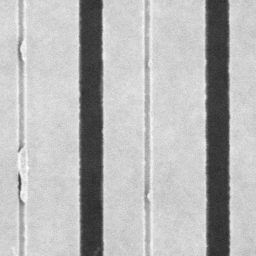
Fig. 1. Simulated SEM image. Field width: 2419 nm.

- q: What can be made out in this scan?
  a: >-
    lines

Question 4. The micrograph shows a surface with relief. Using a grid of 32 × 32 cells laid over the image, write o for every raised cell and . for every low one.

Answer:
oooooooooo...ooooooooooooo...ooo
oooooooooo...ooooooooooooo...ooo
oooooooooo...ooooooooooooo...ooo
oooooooooo...ooooooooooooo...ooo
oooooooooo...ooooooooooooo...ooo
oooooooooo...ooooooooooooo...ooo
oooooooooo...ooooooooooooo...ooo
oooooooooo...ooooooooooooo...ooo
oooooooooo...ooooooooooooo...ooo
oooooooooo...ooooooooooooo...ooo
oooooooooo...ooooooooooooo...ooo
oooooooooo...ooooooooooooo...ooo
oooooooooo...ooooooooooooo...ooo
oooooooooo...ooooooooooooo...ooo
oooooooooo...ooooooooooooo...ooo
oooooooooo...ooooooooooooo...ooo
oooooooooo...ooooooooooooo...ooo
oooooooooo...ooooooooooooo...ooo
oooooooooo...ooooooooooooo...ooo
oooooooooo...ooooooooooooo...ooo
oooooooooo...ooooooooooooo...ooo
oooooooooo...ooooooooooooo...ooo
oooooooooo...ooooooooooooo...ooo
oooooooooo...ooooooooooooo...ooo
oooooooooo...ooooooooooooo...ooo
oooooooooo...ooooooooooooo...ooo
oooooooooo...ooooooooooooo...ooo
oooooooooo...ooooooooooooo...ooo
oooooooooo...ooooooooooooo...ooo
oooooooooo...ooooooooooooo...ooo
oooooooooo...ooooooooooooo...ooo
oooooooooo...ooooooooooooo...ooo